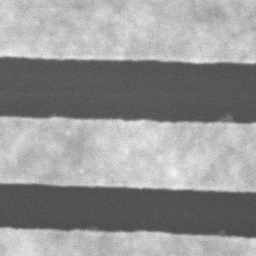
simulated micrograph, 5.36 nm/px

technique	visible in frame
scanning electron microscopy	lines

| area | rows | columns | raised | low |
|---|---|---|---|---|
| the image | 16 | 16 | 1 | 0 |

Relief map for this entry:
1111111111111111
1111111111111111
1111111111111111
1111111111111111
0000000000000000
0000000000000000
0000000000000000
1111100000000000
1111111111111111
1111111111111111
1111111111111111
0001111111111111
0000000000000000
0000000000000000
1111111011000000
1111111111111111